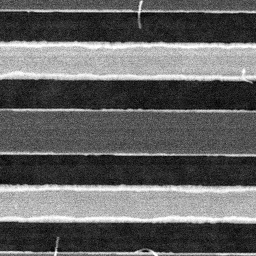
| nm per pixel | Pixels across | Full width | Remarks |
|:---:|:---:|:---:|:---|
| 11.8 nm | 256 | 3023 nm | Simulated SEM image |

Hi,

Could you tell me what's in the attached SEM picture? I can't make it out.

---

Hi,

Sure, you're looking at lines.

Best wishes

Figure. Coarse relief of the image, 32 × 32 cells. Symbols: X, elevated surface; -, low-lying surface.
XXXXXXXXXXXXXXXXXXXXXXXXXXXXXXXX
-----------------X--------XXXXXX
--------------------------------
--------------------------------
--------------------------------
XXXXXXXXXXX---------X-----------
XXXXXXXXXXXXXXXXXXXXXXXXXXXXXXXX
XXXXXXXXXXXXXXXXXXXXXXXXXXXXXXXX
XXXXXXXXXXXXXXXXXXXXXXXXXXXXXXXX
XXXXXXXXXXXXXXXXXXXXXXXXXXXXXXXX
--------------------------------
--------------------------------
--------------------------------
--------------------------------
XXXXXXXXXXXXXXXXXXXXXXXXXXXXXXXX
XXXXXXXXXXXXXXXXXXXXXXXXXXXXXXXX
XXXXXXXXXXXXXXXXXXXXXXXXXXXXXXXX
XXXXXXXXXXXXXXXXXXXXXXXXXXXXXXXX
XXXXXXXXXXXXXXXXXXXXXXXXXXXXXXXX
--------------------------------
--------------------------------
--------------------------------
--------------------------------
XXXXXXXXXXXXXXXXXXXXXXX--------X
XXXXXXXXXXXXXXXXXXXXXXXXXXXXXXXX
XXXXXXXXXXXXXXXXXXXXXXXXXXXXXXXX
XXXXXXXXXXXXXXXXXXXXXXXXXXXXXXXX
XXXXXXXXXXXXXXXXXXXXXXXXXXXXXXXX
--------------------------------
--------------------------------
--------------------------------
XXXX--XX--------XXXX------------